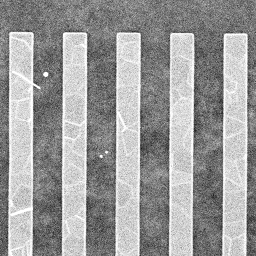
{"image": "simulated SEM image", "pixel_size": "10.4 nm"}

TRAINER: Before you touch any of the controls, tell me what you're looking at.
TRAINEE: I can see wiring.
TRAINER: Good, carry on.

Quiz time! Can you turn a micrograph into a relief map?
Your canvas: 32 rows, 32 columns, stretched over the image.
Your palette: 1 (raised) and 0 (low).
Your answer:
00000000000000000000000000000000
00000000000000000000000000000000
00000000000000000000000000000000
00000000000000000000000000000000
01110000111000011000011100001110
01110000111000011000011100001110
01110000111000011000011100001110
01110000111000011000011100001110
01110000111000011000011100001110
01110000111000011000011100001110
01110000111000011000011100001110
01110000111000011000011100001110
01110000111000011000011100001110
01110000111000011000011100001110
01110000111000011000011100001110
01110000111000011000011100001110
01110000111000011000011100001110
01110000111000011000011100001110
01110000111000011000011100001110
01110000111000011000011100001110
01110000111000011000011100001110
01110000111000011000011100001110
01110000111000011000011100001110
01110000111000011000011100001110
01110000111000011000011100001110
01110000111000011000011100001110
01110000111000011000011100001110
01110000111000011000011100001110
01110000111000011000011100001110
01110000111000011000011100001110
01110000111000011000011100001110
01110000111000011000011100001110